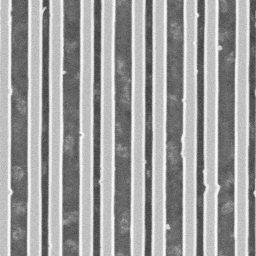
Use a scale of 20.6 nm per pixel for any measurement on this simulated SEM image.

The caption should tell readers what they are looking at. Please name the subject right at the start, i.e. parallel lines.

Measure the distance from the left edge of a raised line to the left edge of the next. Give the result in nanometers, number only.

534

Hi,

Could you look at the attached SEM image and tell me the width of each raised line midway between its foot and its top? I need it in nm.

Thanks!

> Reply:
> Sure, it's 238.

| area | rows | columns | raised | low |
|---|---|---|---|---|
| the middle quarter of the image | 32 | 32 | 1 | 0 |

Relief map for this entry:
00001110001100000111000110000011
00001110001100000111000110000011
00001110001100000111000110000011
00001110001100000111000110000011
00001110001100000111000110000011
00001110001100000111001110000011
00001110001100000111001110000011
00001110001100000111001110000011
00001110001100000111001110000011
00001110001100000111001110000011
00001110001100000111001110000011
00001110001100000111001110000011
00001110001100000111001110000011
00001110011100000111001110000011
00001110011100000111001110000011
00001110011100000111001110000011
00001110011100000111000110000011
00000110011100000111000110000011
00001110011100000111000110000011
00001110011100000111000110000011
00001110011100000111000110000011
00001110011100000111000110000011
00001110011100000111000110000011
00001110011100000111000110000011
00001110011100000111000110000011
00001110011100000111000110000011
00001110011100000111000110000011
00001110011100000111000110000011
00001110011100000111000110000011
00001110011100000111000110000011
00001110011100000111001110000011
00001110011100000111000110000011